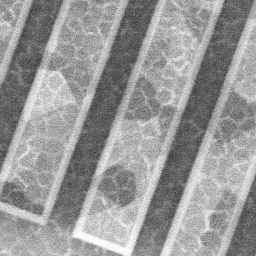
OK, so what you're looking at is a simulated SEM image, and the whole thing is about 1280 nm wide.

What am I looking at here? one or a few lines or trenches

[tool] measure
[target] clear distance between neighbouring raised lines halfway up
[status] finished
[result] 0.179 µm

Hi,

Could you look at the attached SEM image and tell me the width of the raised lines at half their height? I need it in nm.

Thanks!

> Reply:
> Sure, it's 270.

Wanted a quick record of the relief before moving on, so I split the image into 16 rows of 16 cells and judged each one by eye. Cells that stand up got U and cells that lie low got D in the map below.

UUDDUUUUDDUUUUDD
UDDDUUUDDDUUUDDD
UDDUUUUDDUUUUDDU
UDDUUUUDDUUUDDDU
DDDUUUDDDUUUDDUU
DDUUUUDDUUUUDDUU
DDUUUDDDUUUDDDUU
DUUUUDDUUUUDDUUU
DUUUUDDUUUUDDUUU
DUUUDDDUUUDDDUUU
UUUUDDUUUUDDUUUU
UUUUDDUUUUDDUUUD
UUUDDDUUUDDDUUUD
DDUDDUUUUDDUUUUD
DDDDDUUUDDDUUUDD
DDDDDDDUDDUUUUDD